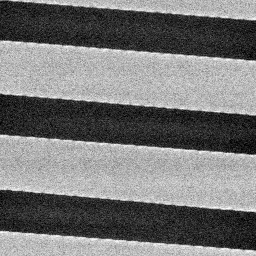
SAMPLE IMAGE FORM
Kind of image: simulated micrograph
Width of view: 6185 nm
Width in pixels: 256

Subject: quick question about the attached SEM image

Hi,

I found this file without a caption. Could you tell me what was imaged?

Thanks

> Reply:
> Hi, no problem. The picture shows lines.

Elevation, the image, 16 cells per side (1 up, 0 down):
0000000111111111
0000000000000000
0000000000000000
1111111111110000
1111111111111111
1111111111111111
0000000011111111
0000000000000000
1000000000000000
1111111111111000
1111111111111111
1111111111111111
0000000111111111
0000000000000000
1000000000000000
1111111111111100